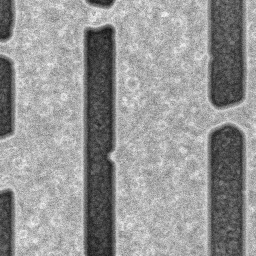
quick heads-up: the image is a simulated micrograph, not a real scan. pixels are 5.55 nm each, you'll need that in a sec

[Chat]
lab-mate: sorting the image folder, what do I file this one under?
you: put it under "one or a few lines or trenches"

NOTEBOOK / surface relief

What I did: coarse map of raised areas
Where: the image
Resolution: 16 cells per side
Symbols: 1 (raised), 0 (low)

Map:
0111111111111001
0111111111111001
1111100111111001
1111100111111001
0111100111111001
0111100111111001
0111100111111001
0111100111111111
1111100111111001
1111100111111001
1111100111111001
1111100111111001
0111100111111001
0111100111111001
0111100111111001
0111100111111001